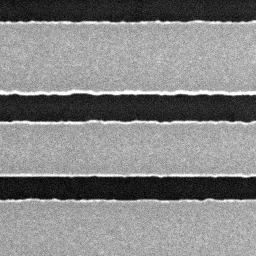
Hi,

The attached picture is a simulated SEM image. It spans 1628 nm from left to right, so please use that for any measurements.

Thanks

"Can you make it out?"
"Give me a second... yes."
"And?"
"lines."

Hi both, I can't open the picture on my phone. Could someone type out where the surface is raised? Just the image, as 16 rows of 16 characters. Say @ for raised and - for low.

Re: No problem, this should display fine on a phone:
----------------
@@@@@@@@@@@@@@@@
@@@@@@@@@@@@@@@@
@@@@@@@@@@@@@@@@
@@@@@@@@@@@@@@@@
@@@@@@@@@@@@@@@@
----------------
----------------
@@@@@@@@@@@@@@@@
@@@@@@@@@@@@@@@@
@@@@@@@@@@@@@@@@
----------------
-@@-------------
@@@@@@@@@@@@@@@@
@@@@@@@@@@@@@@@@
@@@@@@@@@@@@@@@@